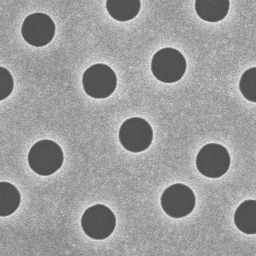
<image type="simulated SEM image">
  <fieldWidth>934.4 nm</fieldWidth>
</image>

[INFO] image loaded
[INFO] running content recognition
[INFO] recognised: a regular array of holes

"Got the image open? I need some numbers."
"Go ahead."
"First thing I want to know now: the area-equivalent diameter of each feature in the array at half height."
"0.125 micrometres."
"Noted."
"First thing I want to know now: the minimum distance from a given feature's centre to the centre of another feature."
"0.247 microns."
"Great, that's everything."